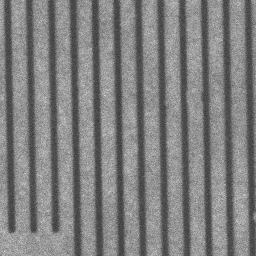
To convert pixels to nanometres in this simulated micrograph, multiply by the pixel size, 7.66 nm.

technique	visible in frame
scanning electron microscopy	parallel lines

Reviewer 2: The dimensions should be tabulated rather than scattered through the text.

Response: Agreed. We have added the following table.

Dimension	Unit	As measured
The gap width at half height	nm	55.5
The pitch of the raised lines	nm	167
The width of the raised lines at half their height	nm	111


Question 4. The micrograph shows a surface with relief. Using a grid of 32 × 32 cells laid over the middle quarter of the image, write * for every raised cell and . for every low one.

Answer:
**..***..***..****..***...***..*
**..***..***..****..***...***..*
**..***..***...***..****..***..*
**..***..***...***..****..***..*
**..***..****..***..****..***..*
**..***..****..***..****..***..*
**..***..****..***..****..***..*
**..***..****..***..****..***..*
**..***..****..***..****..***..*
**..***..****..***..****.****..*
**..***..****..***..****..***..*
**..***..****..***..****..***..*
**..***..****..***..****..***..*
**..***..****..***..****..***..*
**..***..****..***..****..***..*
**..***..****..***..****..***..*
**..***..****..***..****..***..*
**..***..****..***..****..***..*
**..***..****..***..****..***..*
**..***..****..***..****..***..*
**..***..****..***..****..***..*
**..***..****..***..****..***..*
**..***..****..***..****..***..*
**..***..****..***..****..***..*
**..***...***..***..****..***..*
**..***...***..***..****..***..*
**..****..***..***..****..***..*
**..****..***..***..****..***..*
**..****..***..***..****..***..*
**..****..***..***..****..***..*
**..****..***..***..****..***..*
**..****..***..***..****..***...